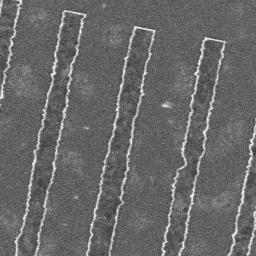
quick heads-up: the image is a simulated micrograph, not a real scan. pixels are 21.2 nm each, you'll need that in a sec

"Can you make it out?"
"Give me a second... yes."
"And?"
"one or a few lines or trenches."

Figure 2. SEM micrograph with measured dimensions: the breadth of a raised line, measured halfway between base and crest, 0.416 micrometres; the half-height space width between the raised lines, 1060 nanometers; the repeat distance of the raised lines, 1510 nm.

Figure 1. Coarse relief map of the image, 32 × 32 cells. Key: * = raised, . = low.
**..............................
**......*.......................
**......**......................
**......**......................
**.....***.......**.............
*......***......***......***....
*......***......***......***....
*......**.......***......***....
*......**.......**.......**.....
*......**......***.......**.....
......***......***.......**.....
......***......***......***.....
......**.......***......***.....
......**.......**.......**......
......**.......**.......**......
.....***......***.......**......
.....***......***......***......
.....**.......**.......***......
.....**.......**.......**......*
....***......***.......**......*
....***......***.......**......*
....***......***......***......*
....**.......***......**.......*
....**.......**.......**......**
....**......***.......**......**
...***......***......***......**
...***......***......***......**
...**.......***......**.......**
...**......***.......**.......**
..***......***.......**......***
..***......***.......**......**.
..***......***......***......**.